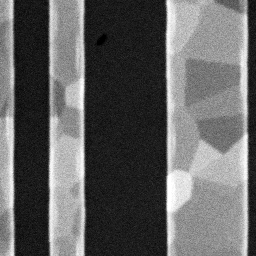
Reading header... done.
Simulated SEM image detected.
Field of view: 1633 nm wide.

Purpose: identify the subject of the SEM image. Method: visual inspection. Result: wiring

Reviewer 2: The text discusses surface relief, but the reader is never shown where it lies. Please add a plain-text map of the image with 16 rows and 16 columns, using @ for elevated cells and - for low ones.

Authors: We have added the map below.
@--@@-----@@@@@-
@--@@-----@@@@@-
@--@@-----@@@@@-
@--@@-----@@@@@-
@--@@-----@@@@@-
@--@@-----@@@@@-
@--@@------@@@@-
@--@@------@@@@-
@--@@------@@@@-
@--@@------@@@@-
@--@@------@@@@-
@--@@------@@@@-
@--@@-----@@@@@-
@--@@-----@@@@@-
@--@@------@@@@-
@--@@------@@@@-